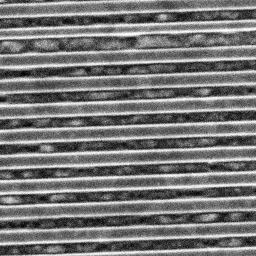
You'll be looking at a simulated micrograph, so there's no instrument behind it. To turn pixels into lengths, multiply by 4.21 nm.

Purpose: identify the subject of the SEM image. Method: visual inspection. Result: parallel lines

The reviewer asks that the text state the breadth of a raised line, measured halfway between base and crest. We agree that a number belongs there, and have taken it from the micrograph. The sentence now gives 0.0537 micrometres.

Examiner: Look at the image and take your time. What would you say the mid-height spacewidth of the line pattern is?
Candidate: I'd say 53.7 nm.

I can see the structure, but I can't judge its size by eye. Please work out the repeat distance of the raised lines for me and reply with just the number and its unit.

107 nm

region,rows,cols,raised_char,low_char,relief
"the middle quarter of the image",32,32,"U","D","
DDDDDDDDDDDDDDDDDDDDDDDDDDDDDDDD
DDDDDDDDDDDDDDDDDDDDDDDDDDDDDDDD
DDDDDDDDDDDDDDDDDDDDDDDDDDDDDDDU
DDDDUUUUUUUUUUUUUUUUUUUUUUUUUUUU
UUUUUUUUUUUUUUUUUUUUUUUUUUUUUUUU
UUUUUUUUUUUUUUUUUUUUUUUUUUUUUUDD
UUDDDDDDDDDDDDDDDDDDDDDDDDDDDDDD
DDDDDDDDDDDDDDDDDDDDDDDDDDDDDDDD
DDDDDDDDDDDDDDDDDDDDDDDDDDDDDDDD
DDDDDDDDDDDDDUUUUUUUUUUUUUUUUUUU
UUUUUUUUUUUUUUUUUUUUUUUUUUUUUUUU
UUUUUUUUUUUUUUUUUUUUUUUUUUUUUUUU
UUUUUUUUUUUUDDDDDDDDDDDDDDDDDDDD
DDDDDDDDDDDDDDDDDDDDDDDDDDDDDDDD
DDDDDDDDDDDDDDDDDDDDDDDDDDDDDDDD
DDDDDDDDDDDDDDDDDDUUUUUUUUUUUUUU
UUUUUUUUUUUUUUUUUUUUUUUUUUUUUUUU
UUUUUUUUUUUUUUUUUUUUUUUUUUUUUUUU
UUUUUUUUUUUUUUUUDDDDDDDDDDDDDDDD
DDDDDDDDDDDDDDDDDDDDDDDDDDDDDDDD
DDDDDDDDDDDDDDDDDDDDDDDDDDDDDDDD
DDDDDDDDDDDDDDDDDDDDDDDDDDDUUUUU
UUUUUUUUUUUUUUUUUUUUUUUUUUUUUUUU
UUUUUUUUUUUUUUUUUUUUUUUUUUUUUUUU
UUUUUUUUUUUUUUUUUUUUUUUUUUDDDDDD
DDDDDDDDDDDDDDDDDDDDDDDDDDDDDDDD
DDDDDDDDDDDDDDDDDDDDDDDDDDDDDDDD
DDDDDDDDDDDDDDDDDDDDDDDDDDDDDDDD
DDDDDDDDDDUUUUUUUUUUUUUUUUUUUUUU
UUUUUUUUUUUUUUUUUUUUUUUUUUUUUUUU
UUUUUUUUUUUUUUUUUUUUUUUUUUUUUUUU
UUUUUUUUUDDDDDDDDDDDDDDDDDDDDDDD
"